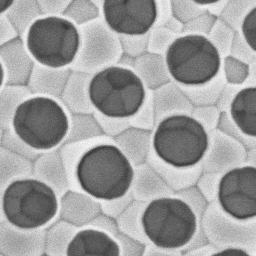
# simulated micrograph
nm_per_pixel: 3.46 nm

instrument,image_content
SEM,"a regular array of holes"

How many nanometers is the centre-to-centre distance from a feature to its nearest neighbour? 281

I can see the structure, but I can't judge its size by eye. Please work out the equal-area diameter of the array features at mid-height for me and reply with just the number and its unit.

180 nm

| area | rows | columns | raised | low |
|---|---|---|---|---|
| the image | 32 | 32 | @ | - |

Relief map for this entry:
-@@@@@@@@@@@@------@@@@@@-@@@@@@
@@@@@@@@@@@@@-------@@@@@@@@@@@-
@@@@@---@@@@@------@@@@@@@@@@@@-
@@@@-----@@@@@-----@@@@@@@@@@@--
@@@-------@@@@@@@@@@@@@--@@@@@@-
@@@-------@@@@@@@@@@@@----@@@@@-
@@@@------@@@@@@@@@@@------@@@@@
@@@@@----@@@@@@@@@@@@------@@@@@
@@@@@@@@@@@@@@-@@@@@@------@@@@@
@@@@@@@@@@@@-----@@@@@-----@@@@@
@@@@@@@@@@@-------@@@@@--@@@@@@@
@@@@@@@@@@@-------@@@@@@@@@@@@--
@@@---@@@@@-------@@@@@@@@@@@---
@@------@@@@-----@@@@@@@@@@@@---
@@------@@@@@@--@@@@@@-@@@@@@---
@@------@@@@@@@@@@@@-----@@@@@--
@@------@@@@@@@@@@@-------@@@@--
@@@-----@@@@@@@@@@@-------@@@@@@
@@@@--@@@@@@---@@@@-------@@@@@@
@@@@@@@@@@------@@@@-----@@@@@@@
@@@@@@@@@@------@@@@@---@@@@@@@@
@@@@@@@@@@-------@@@@@@@@@@@@---
@@@-@@@@@@------@@@@@@@@@@@@----
@-----@@@@------@@@@@@@@@@@-----
-------@@@@@---@@@@@@@@@@@@-----
-------@@@@@@@@@@@@----@@@@@----
@------@@@@@@@@@@@------@@@@----
@-----@@@@@@@@@@@@------@@@@@@@@
@@@-@@@@@@@@@@@@@@------@@@@@@@@
@@@@@@@@@----@@@@@------@@@@@@@@
@@@@@@@@@-----@@@@@----@@@@@@@@@
@@@@@@@@-------@@@@@@@@@@@@@---@